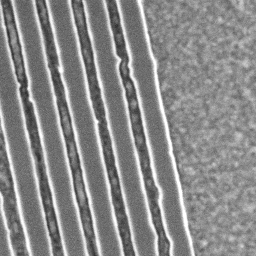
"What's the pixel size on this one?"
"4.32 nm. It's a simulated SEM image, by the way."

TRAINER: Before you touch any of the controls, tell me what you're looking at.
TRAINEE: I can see parallel lines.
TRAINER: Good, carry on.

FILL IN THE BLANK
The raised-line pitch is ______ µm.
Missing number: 0.149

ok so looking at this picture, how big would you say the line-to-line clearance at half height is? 52.8 nm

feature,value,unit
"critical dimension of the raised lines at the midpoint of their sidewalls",22.6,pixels